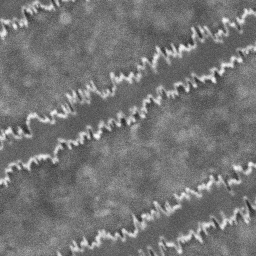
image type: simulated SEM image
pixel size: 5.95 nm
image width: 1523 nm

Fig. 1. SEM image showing one or a few lines or trenches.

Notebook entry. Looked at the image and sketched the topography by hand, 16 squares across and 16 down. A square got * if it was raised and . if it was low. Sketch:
**..............
*..............*
............****
..........*****.
.........*****..
.......****.....
....*****.......
..******........
*****...........
****............
*..............*
.............***
...........*****
.........******.
........****....
.....*****......